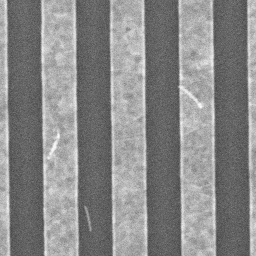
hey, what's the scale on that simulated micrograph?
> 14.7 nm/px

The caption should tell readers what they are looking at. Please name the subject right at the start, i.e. wiring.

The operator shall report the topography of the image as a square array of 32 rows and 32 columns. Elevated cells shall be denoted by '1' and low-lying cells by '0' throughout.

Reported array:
10000111100000111100001111000001
10000111100000111100001111100001
10000111100000111100001111100001
10000111100000111100001111100001
10000111100000111100001111100001
10000111100000111100001111100001
10000111100000111100001111100001
10000111100000111100001111100001
10000111100000111100001111100001
10000111100000111100000111100001
10000111100000111100001111100001
10000111100000111100000111100001
10000111100000111100000111100001
10000111100000111100000111100001
10000111100000111100000111100001
10000111110000111100000111100001
10000111110000111100000111100001
10000111110000111100000111100001
10000111110000111100000111100001
10000111110000111100000111100001
10000111110000111100000111100001
10000111110000111100000111100001
10000011110000111100000111100001
10000011110000111100000111100001
10000011110000111100000111100001
10000011110000111100000111100001
10000011110000111100000111100001
10000011110000111100000111100001
10000011110000111100000111100001
10000011110000111100000111100001
10000011110000111100000111100001
10000011110000111100000111100001